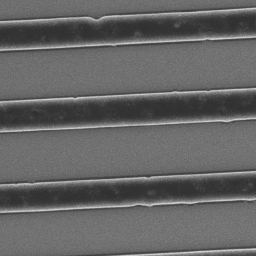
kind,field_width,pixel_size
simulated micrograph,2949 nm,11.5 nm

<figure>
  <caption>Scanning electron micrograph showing one or a few lines or trenches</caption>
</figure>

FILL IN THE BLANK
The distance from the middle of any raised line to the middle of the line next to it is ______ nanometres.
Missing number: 935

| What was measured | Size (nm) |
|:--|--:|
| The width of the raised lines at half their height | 332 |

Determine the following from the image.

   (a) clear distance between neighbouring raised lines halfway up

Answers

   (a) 51 px